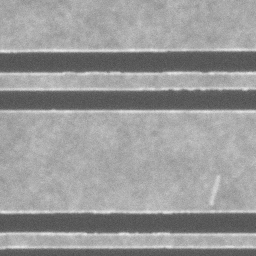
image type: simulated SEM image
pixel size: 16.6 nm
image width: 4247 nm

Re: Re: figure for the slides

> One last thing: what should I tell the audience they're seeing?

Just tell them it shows lines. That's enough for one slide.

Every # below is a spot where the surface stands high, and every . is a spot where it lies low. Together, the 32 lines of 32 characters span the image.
################################
################################
################################
################################
################################
################################
................................
................................
................................
################################
################################
................................
................................
................................
################################
################################
################################
################################
################################
################################
################################
################################
################################
################################
################################
################################
................................
................................
................................
################################
################################
................................